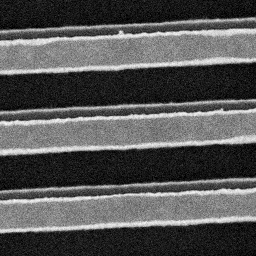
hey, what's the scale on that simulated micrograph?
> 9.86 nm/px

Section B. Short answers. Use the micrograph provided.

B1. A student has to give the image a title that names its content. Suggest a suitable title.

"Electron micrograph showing lines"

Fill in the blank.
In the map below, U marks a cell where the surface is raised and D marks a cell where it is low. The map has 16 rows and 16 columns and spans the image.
DDDDDDDDDDDDDDDD
DDDDDDDDDDUUUUUU
UUUUUUUUUUUUUUUU
UUUUUUUUUUUUUUUU
UUDDDDDDDDDDDDDD
DDDDDDDDDDDDDDDD
DDDDDDDDDDUUUUUU
UUUUUUUUUUUUUUUU
UUUUUUUUUUUUUUUU
UUDDDDDDDDDDDDDD
DDDDDDDDDDDDDDDD
DDDDDDDDDDUUUUUU
UUUUUUUUUUUUUUUU
UUUUUUUUUUUUUUUU
UDDDDDDDDDDDDDDD
DDDDDDDDDDDDDDDD